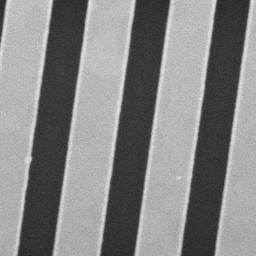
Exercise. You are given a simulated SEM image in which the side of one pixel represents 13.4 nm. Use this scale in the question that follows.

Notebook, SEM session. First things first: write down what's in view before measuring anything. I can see lines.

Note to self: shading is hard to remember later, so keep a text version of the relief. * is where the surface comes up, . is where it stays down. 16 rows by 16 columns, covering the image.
***..***...**...
***..***..***..*
***..***..***..*
***..***..***..*
***..***..***..*
***..***..***..*
**...***..***..*
**..***...**...*
**..***..***..**
**..***..***..**
**..***..***..**
**..***..***..**
**..***..***..**
*...***..***..**
*..***...**...**
*..***..***..***